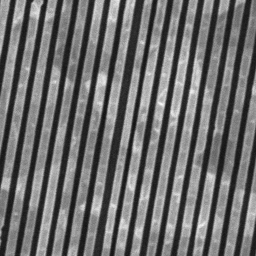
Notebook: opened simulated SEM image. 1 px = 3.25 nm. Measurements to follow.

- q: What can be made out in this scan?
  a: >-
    parallel lines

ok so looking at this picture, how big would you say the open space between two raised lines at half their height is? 22 nanometres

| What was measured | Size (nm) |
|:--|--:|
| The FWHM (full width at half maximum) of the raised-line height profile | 27.2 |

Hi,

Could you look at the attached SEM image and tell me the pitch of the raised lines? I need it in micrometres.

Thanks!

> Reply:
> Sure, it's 0.0503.